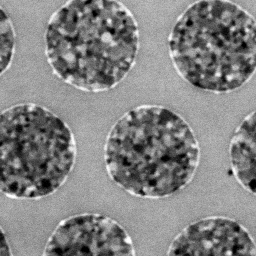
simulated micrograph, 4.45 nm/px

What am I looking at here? raised bodies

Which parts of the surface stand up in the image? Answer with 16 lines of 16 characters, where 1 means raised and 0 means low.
0000111100001110
1001111100011111
1001111110011111
1001111100011111
0000111100011111
0000011000001110
0000000000000000
1111000111100001
1111000111110001
1111100111110011
1111000111110001
1111000111110001
0000000000000000
0000010000000000
0001111100011110
1001111100011111